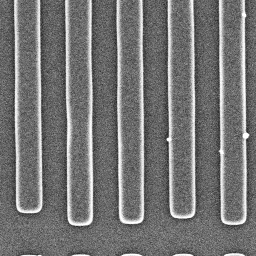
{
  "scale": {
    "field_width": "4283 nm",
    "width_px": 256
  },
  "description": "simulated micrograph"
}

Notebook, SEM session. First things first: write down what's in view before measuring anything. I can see groups of lines, slits or small figures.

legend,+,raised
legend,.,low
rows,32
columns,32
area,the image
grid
..+++...+++....+++...+++...++++.
..+++...+++....+++...+++...++++.
..+++...+++....+++...+++...++++.
..+++...+++....+++...+++...+++..
..+++...+++....+++...+++....++..
..+++...+++....+++...+++....++..
..+++...+++....+++...+++....++..
..+++...+++....+++...+++....++..
..+++...+++....+++...+++....+++.
..+++...+++....+++...+++....+++.
..+++...+++....+++...+++....+++.
..+++...+++....+++...+++....+++.
..+++...+++....+++...+++....+++.
..+++...+++....+++...+++....+++.
..+++....++....+++...+++....+++.
..+++....++....+++...+++....+++.
..+++....++....+++...+++....+++.
..+++....++....+++...+++....+++.
..+++....++....+++...+++....+++.
..+++....++....+++...+++....+++.
..+++....++....+++...+++....+++.
..+++....++....+++...+++....+++.
..+++....++....+++...+++....+++.
..+++....++....+++...+++....+++.
..+++....++....+++...+++....+++.
..+++....++....+++...+++....+++.
...++....++....+++...+++....+++.
.........++....+++..........+++.
................................
................................
................................
................................